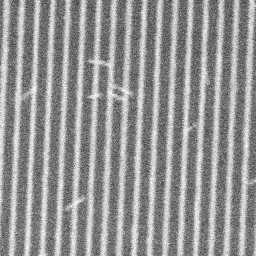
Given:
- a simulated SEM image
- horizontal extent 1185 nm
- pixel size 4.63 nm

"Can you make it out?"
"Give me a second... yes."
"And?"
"parallel lines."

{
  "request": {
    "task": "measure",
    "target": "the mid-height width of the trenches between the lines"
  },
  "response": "0.0492 µm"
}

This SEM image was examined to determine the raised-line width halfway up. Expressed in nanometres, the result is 22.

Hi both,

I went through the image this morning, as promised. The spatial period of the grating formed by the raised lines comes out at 70.9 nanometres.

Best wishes